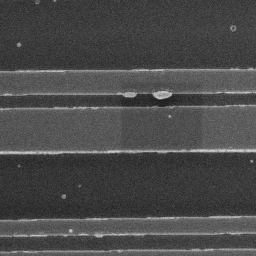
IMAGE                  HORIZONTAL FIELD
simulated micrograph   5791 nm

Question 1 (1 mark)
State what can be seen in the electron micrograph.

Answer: lines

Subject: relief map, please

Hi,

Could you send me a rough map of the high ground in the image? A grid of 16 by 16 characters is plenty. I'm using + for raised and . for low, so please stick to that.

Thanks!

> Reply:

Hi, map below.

................
................
................
................
..++++++++++++++
++++++++++++++++
++++++++++++++++
++++++++++++++++
++++++++++++++++
++++............
................
................
................
................
++++++++++++++++
++++++++++++++++